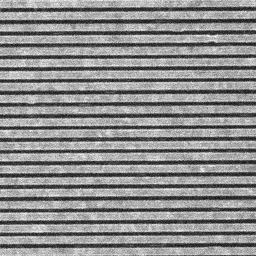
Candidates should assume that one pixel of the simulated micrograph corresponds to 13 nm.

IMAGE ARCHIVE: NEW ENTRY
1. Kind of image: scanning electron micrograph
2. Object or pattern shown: parallel lines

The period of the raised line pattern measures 154 nm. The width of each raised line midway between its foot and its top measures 6.62 px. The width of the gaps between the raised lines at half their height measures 0.0617 µm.